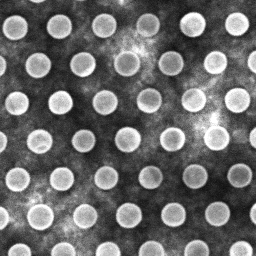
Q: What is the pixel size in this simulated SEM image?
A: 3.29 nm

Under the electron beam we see a regular array of raised bodies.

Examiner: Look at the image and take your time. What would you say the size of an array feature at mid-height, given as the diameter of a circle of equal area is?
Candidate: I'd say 76.3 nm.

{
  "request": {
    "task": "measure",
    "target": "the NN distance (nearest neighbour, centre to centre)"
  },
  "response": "143 nanometers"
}